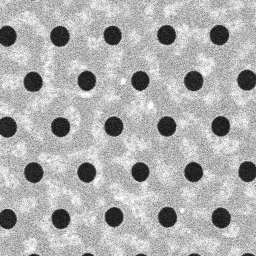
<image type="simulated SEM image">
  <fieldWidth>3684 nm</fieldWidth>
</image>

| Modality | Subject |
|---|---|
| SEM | a regular array of holes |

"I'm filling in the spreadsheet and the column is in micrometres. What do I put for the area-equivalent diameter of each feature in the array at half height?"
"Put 0.289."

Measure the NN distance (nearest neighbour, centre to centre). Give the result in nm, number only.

755